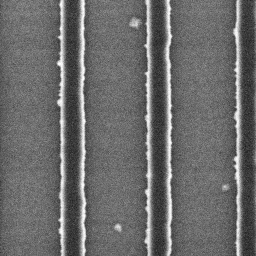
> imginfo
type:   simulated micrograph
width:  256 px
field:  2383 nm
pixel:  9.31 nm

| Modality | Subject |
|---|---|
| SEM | lines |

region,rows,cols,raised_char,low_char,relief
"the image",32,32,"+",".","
........++........+++.........++
........++........+++.........++
........++........+++.........++
........++........+++.........++
........++........+++.........++
........++........+++.........++
........++........+++.........++
........++........+++.........++
........++.........++.........++
........++........+++.........++
........++........+++.........++
........++........+++.........++
........++........+++.........++
........++........+++.........++
........++........+++.........++
........+++.......+++.........++
........++........+++.........++
........++........+++.........++
........+++........++.........++
........+++........++.........++
........++.........++.........++
........++.........++.........++
........++.........++.........++
........++.........++.........++
........+++.......+++.........++
........+++.......+++.........++
........+++........++.........++
........+++........++.........++
........+++........++.........++
........+++........++.........++
........++.........++.........++
........+++........++.........++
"